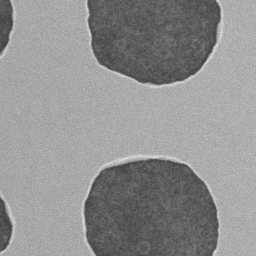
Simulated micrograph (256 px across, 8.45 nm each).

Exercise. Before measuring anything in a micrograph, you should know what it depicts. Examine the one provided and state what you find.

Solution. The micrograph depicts holes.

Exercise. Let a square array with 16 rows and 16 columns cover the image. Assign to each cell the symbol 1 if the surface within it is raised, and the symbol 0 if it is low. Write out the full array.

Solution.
0111110000000011
0111110000000011
0111110000000011
1111110000000111
1111111000001111
1111111111111111
1111111111111111
1111111111111111
1111111111111111
1111111111111111
1111111000001111
1111110000000111
1111100000000111
0111100000000011
0111100000000011
1111110000000111